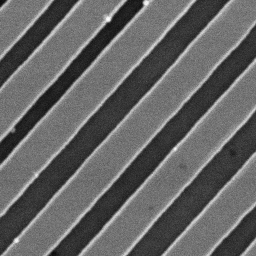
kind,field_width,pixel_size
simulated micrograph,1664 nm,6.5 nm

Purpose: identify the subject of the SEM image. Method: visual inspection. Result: lines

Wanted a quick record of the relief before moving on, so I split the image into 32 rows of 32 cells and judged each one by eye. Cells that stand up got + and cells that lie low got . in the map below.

++++++....+++++...++++++....++++
+++++....++++++..++++++....+++++
+++++...++++++..++++++.....+++++
++++...++++++..++++++.....+++++.
+++...++++++...+++++.....++++++.
++...++++++...++++++....++++++..
+...++++++...++++++....++++++...
...++++++...++++++....++++++....
..++++++...++++++....++++++....+
.++++++...++++++....++++++....++
++++++...++++++....++++++....+++
++++++..++++++.....+++++....++++
+++++..++++++.....+++++....+++++
++++..++++++.....++++++...++++++
+++...+++++.....++++++...++++++.
++...++++++....++++++....+++++..
+...++++++....++++++....++++++..
...++++++....++++++....++++++...
..++++++....++++++....++++++....
.++++++....++++++....++++++.....
++++++....++++++....++++++.....+
+++++.....+++++....++++++.....++
++++.....+++++....++++++.....+++
+++.....++++++...++++++.....++++
+++....++++++...++++++.....+++++
++....++++++....+++++.....++++++
+....++++++....+++++.....++++++.
....++++++....++++++....++++++..
...++++++....++++++....++++++...
..++++++....++++++....++++++....
.++++++....++++++.....+++++....+
.+++++....++++++.....++++++....+